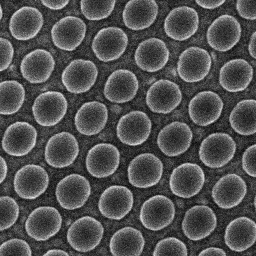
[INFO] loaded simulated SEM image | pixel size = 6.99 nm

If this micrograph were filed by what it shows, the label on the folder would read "a regular array of raised bodies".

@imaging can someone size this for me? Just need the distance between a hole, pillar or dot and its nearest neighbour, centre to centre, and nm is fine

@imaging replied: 300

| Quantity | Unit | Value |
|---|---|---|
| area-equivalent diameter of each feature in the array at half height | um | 0.233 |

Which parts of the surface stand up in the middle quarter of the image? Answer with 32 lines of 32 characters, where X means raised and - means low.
-XXXXXXX-----------XXXXXX----XXX
XXXXXXXX-------------XX------XXX
XXXXXXXX----XXXXX------------XXX
XXXXXXXX---XXXXXXX------------XX
XXXXXXX----XXXXXXX------XX------
-XXXXX-----XXXXXXX----XXXXXX----
-XXXXX----XXXXXXXX---XXXXXXX----
-----------XXXXXXX---XXXXXXXX---
-----------XXXXXX----XXXXXXXX---
---------------------XXXXXXXX---
-----XXXXX-----------XXXXXXX---X
----XXXXXXX-----------XXXXX----X
---XXXXXXXX-----XXXX------------
---XXXXXXX-----XXXXXX-----------
---XXXXXXX----XXXXXXX-----------
---XXXXXXX----XXXXXXXX----XXXX--
----XXXXX----XXXXXXXX----XXXXXX-
X-----X-------XXXXXXX---XXXXXXXX
XX------------XXXXXX----XXXXXXXX
XXX------------XXXX-----XXXXXXX-
XXX-----XXXX------------XXXXXXX-
XXX----XXXXXX------------XXXXX--
XXX---XXXXXXX-------------XX----
XXX---XXXXXXXX----XXXXX---------
XX----XXXXXXXX---XXXXXXX--------
------XXXXXXX----XXXXXXX-----XXX
------XXXXXX----XXXXXXXX----XXXX
-------XXXX-----XXXXXXXX---XXXXX
-XXXX-----------XXXXXXXX---XXXXX
XXXXXX-----------XXXXXX----XXXXX
XXXXXX-------------XX------XXXXX
XXXXXX-----XXXXX-----------XXXXX